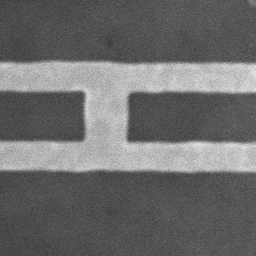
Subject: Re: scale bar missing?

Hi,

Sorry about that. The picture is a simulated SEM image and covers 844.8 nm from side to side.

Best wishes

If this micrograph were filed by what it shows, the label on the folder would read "groups of lines, slits or small figures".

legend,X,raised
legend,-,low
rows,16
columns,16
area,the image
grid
----------------
----------------
----------------
----------------
XXXXXXXXXXXXXXXX
XXXXXXXXXXXXXXXX
-----XXX--------
-----XXX--------
-----XXX--------
XXXXXXXXXXXXXXXX
XXXXXXXXXXXXXXXX
----------------
----------------
----------------
----------------
----------------